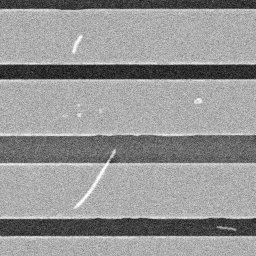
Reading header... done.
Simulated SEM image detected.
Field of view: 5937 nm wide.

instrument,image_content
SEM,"lines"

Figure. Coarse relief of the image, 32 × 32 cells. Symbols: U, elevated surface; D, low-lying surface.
DDDDDDDDDDDDDDDDDDDDDDDDDDDDDDDD
UUUUUUUUUUUUUUUUUUUUUUUUUUUUUUUU
UUUUUUUUUUUUUUUUUUUUUUUUUUUUUUUU
UUUUUUUUUUUUUUUUUUUUUUUUUUUUUUUU
UUUUUUUUUUUUUUUUUUUUUUUUUUUUUUUU
UUUUUUUUUUUUUUUUUUUUUUUUUUUUUUUU
UUUUUUUUUUUUUUUUUUUUUUUUUUUUUUUU
UUUUUUUUUUUUUUUUUUUUUUUUUUUUUUUU
DDDDDDDDDDDDDDDDDDDDDDDDDDDDDDDD
DDDDDDDDDDDDDDDDDDDDDDDDDDDDDDDD
UUUUUUUUUUUUUUUUUUUUUUUUUUUUUUUU
UUUUUUUUUUUUUUUUUUUUUUUUUUUUUUUU
UUUUUUUUUUUUUUUUUUUUUUUUUUUUUUUU
UUUUUUUUUUUUUUUUUUUUUUUUUUUUUUUU
UUUUUUUUUUUUUUUUUUUUUUUUUUUUUUUU
UUUUUUUUUUUUUUUUUUUUUUUUUUUUUUUU
UUUUUUUUUUUUUUUUUUUUUUUUUUUUUUUU
DDDDDDDDDDDDDDDDDDDDDDDDDDDDDDDD
DDDDDDDDDDDDDDDDDDDDDDDDDDDDDDDD
DDDDDDDDDDDDDDDDDDDDDDDDDDDDDDDD
DDDDDDDDDDDDDUDDDDDDDDDDDDDDDDDD
UUUUUUUUUUUUUUUUUUUUUUUUUUUUUUUU
UUUUUUUUUUUUUUUUUUUUUUUUUUUUUUUU
UUUUUUUUUUUUUUUUUUUUUUUUUUUUUUUU
UUUUUUUUUUUUUUUUUUUUUUUUUUUUUUUU
UUUUUUUUUUUUUUUUUUUUUUUUUUUUUUUU
UUUUUUUUUUUUUUUUUUUUUUUUUUUUUUUU
DDDDDDDDDDDDDDDDDDDDDDDDDDDDDDDD
DDDDDDDDDDDDDDDDDDDDDDDDDDDDDDDD
DDDDDDDDDDDDDDDDDDDDDDDDDDDDDDDD
UUUUUUUUUUUUUUUUUUUUUUUUUUUUUUUU
UUUUUUUUUUUUUUUUUUUUUUUUUUUUUUUU